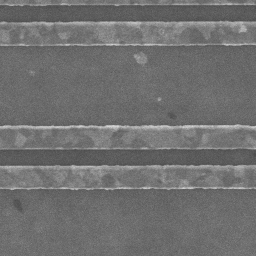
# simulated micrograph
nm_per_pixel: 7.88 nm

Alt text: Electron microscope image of lines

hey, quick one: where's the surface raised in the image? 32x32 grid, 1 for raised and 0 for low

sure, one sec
11111111111111111111111111111111
00000000000000000000000000000000
00000000000000000000000000000000
11111111111111111111111111111111
11111111111111111111111111111111
11111111111111111111111111111111
00000000000000000000000000000000
00000000000000000000000000000000
00000000000000000000000000000000
00000000000000000000000000000000
00000000000000000000000000000000
00000000000000000000000000000000
00000000000000000000000000000000
00000000000000000000000000000000
00000000000000000000000000000000
00000000000000000000000000000000
11111111111111111111111111111111
11111111111111111111111111111111
11111111111111111111101111111101
00000000000000000000000000000000
00000000000000000000000000000000
11111111111111111111111111111111
11111111111111111111111111111111
11111111111111111111111111111111
00000000000000000000000000000000
00000000000000000000000000000000
00000000000000000000000000000000
00000000000000000000000000000000
00000000000000000000000000000000
00000000000000000000000000000000
00000000000000000000000000000000
00000000000000000000000000000000